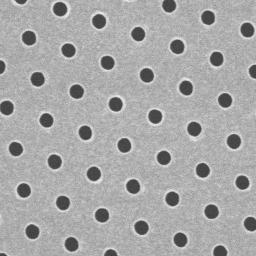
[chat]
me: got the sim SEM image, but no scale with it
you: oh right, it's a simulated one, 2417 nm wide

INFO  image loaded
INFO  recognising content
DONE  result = a regular array of holes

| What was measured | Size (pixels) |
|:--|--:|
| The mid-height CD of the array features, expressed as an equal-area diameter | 14.3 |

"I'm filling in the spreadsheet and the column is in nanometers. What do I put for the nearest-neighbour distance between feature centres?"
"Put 386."